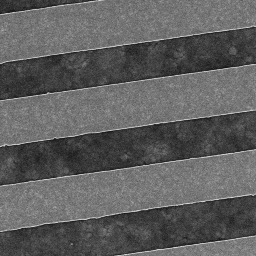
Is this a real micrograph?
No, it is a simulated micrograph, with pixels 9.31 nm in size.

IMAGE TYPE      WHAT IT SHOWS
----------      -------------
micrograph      one or a few lines or trenches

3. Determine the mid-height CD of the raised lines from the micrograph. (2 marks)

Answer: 421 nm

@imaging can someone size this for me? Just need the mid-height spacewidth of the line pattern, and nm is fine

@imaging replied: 362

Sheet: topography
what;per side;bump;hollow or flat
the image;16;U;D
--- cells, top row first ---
DDDUUUUUUUUUUUUU
UUUUUUUUUUUUUUUU
UUUUUUUUUUDDDDDD
UUUDDDDDDDDDDDDD
DDDDDDDDDDDDDUUU
DDDDDDUUUUUUUUUU
UUUUUUUUUUUUUUUU
UUUUUUUUUUUUDDDD
UUUUUDDDDDDDDDDD
DDDDDDDDDDDDDDDU
DDDDDDDDUUUUUUUU
DUUUUUUUUUUUUUUU
UUUUUUUUUUUUUDDD
UUUUUUUDDDDDDDDD
DDDDDDDDDDDDDDDD
DDDDDDDDDDDUUUUU